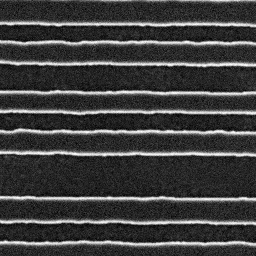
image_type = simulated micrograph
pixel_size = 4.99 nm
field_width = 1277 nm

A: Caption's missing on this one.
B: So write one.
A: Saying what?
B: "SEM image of lines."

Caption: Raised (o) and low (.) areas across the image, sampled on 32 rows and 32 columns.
oooooooooooooooooooooooooooooooo
oooooooooooooooooooooooooooooooo
oooooooooooooooooooooooooooooooo
................................
................................
oooooooooooooooooooooooooooooooo
oooooooooooooooooooooooooooooooo
oooooooooooooooooooooooooooooooo
................................
................................
................................
ooooo.ooooo..oooooo.............
oooooooooooooooooooooooooooooooo
oooooooooooooooooooooooooooooooo
................................
................................
oooooooooooooooooooooooooooooo..
oooooooooooooooooooooooooooooooo
oooooooooooooooooooooooooooooooo
................................
................................
................................
................................
................................
................................
oooooooooooooooooooooooooooooooo
oooooooooooooooooooooooooooooooo
oooooooooooooooooooooooooooooooo
................................
................................
ooooooooooooooooo...oooooooooooo
oooooooooooooooooooooooooooooooo